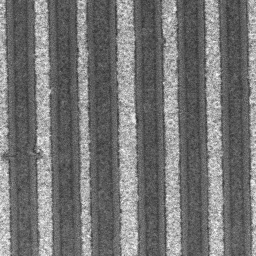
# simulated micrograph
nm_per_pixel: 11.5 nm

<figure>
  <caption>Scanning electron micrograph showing parallel lines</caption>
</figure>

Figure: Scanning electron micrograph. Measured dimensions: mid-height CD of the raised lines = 0.234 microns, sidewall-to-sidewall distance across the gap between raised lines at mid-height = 256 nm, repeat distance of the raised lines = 491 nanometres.